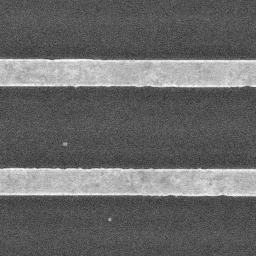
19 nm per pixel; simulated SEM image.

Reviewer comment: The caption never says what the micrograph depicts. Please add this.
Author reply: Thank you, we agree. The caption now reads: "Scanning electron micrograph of lines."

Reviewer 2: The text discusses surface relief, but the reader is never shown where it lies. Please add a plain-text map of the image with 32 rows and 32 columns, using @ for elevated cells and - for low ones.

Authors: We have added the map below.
--------------------------------
--------------------------------
--------------------------------
--------------------------------
--------------------------------
--------------------------------
--------------------------------
--------------------------------
@@@@@@@@@@@@@@@@@@@@@@@@@@@@@@@@
@@@@@@@@@@@@@@@@@@@@@@@@@@@@@@@@
@@@@@@@@@@@@@@@@@@@@@@@@@@@@@@@@
--------------------------------
--------------------------------
--------------------------------
--------------------------------
--------------------------------
--------------------------------
--------------------------------
--------------------------------
--------------------------------
--------------------------------
@@@@@@@@@@@@@@@@@@@@@@@@@@@@@@@@
@@@@@@@@@@@@@@@@@@@@@@@@@@@@@@@@
@@@@@@@@@@@@@@@@@@@@@@@@@@@@@@@@
--------------------------------
--------------------------------
--------------------------------
--------------------------------
--------------------------------
--------------------------------
--------------------------------
--------------------------------